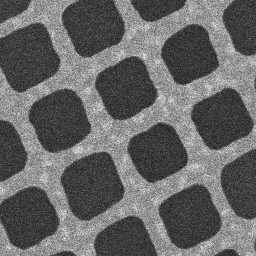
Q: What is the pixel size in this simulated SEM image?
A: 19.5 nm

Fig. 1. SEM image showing holes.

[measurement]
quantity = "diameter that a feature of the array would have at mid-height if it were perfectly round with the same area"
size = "1.16 micrometres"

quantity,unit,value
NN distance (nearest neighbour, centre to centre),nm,1400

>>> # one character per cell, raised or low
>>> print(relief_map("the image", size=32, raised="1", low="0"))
00001111100000110000000111111000
00011111000000011000001111110000
01111111000000001100111111110000
11100011000000001111111000110000
10000011100000011111100000111000
00000001100000011111000000111000
00000001110001111111000000011100
00000000111111100011000000011111
00000001111110000011100000011111
10000001111100000001100000111111
10000111111100000001110011111111
11011110011100000000111111100011
11111000001110000001111110000011
11110000000110000011111100000001
11100000000111000111111100000001
01110000000111111111011100000000
00110000000111111100001110000001
00011000001111110000000110000011
00011000011111110000000111001111
00011111111000110000000111111100
00011111100000111000000111110000
00011111000000011000001111110000
01111111000000011100111111110000
11100111000000001111111000110000
10000011000000011111100000110000
00000001100000111111000000011000
00000001100001111111000000011000
00000001110111100011000000001111
10000001111110000011100000001111
10000011111100000001100000011111
10000111111100000001110001111111
11111111011100000000111111100011